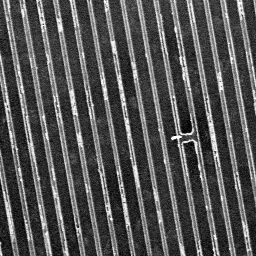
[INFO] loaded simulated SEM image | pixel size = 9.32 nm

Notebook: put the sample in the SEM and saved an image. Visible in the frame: parallel lines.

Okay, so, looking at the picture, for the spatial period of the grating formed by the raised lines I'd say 153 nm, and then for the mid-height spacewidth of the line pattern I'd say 118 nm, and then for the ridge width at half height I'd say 42.5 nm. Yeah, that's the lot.